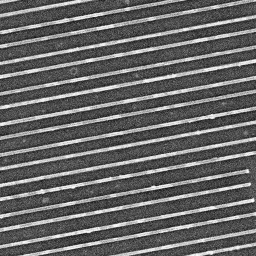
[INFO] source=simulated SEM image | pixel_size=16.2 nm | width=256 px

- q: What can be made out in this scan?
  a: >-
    parallel lines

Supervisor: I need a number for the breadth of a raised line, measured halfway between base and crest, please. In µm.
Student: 0.0476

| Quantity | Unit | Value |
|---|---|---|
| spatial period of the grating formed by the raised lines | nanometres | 243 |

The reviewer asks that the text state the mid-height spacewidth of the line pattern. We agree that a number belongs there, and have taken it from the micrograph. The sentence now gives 177 nm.